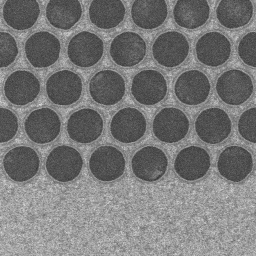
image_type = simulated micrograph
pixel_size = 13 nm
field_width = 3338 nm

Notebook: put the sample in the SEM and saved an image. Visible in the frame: a regular array of holes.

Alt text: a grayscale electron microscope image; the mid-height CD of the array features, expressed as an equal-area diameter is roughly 472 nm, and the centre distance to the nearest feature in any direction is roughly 553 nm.